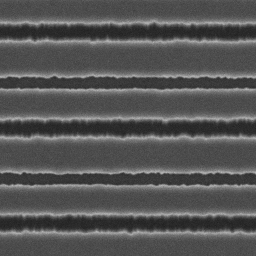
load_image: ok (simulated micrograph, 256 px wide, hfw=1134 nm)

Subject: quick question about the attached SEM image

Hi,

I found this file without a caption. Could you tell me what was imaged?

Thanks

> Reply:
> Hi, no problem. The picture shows lines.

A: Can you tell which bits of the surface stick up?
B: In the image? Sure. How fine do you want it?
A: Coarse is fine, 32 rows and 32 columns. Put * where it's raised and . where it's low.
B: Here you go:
********************************
********************************
********************************
................................
................................
********************************
********************************
********************************
********************************
********************************
********************************
********************************
********************************
********************************
********************************
................................
................................
********************************
********************************
********************************
********************************
********************************
********************************
********************************
********************************
********************************
********************************
................................
................................
********************************
********************************
********************************